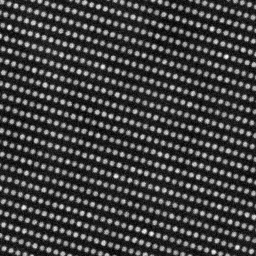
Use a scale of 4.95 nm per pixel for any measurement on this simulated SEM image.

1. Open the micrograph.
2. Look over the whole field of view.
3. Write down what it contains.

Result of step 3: a regular array of raised bodies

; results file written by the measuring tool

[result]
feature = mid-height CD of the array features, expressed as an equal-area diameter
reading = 21.6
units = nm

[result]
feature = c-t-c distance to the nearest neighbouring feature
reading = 0.0349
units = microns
